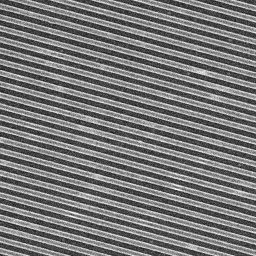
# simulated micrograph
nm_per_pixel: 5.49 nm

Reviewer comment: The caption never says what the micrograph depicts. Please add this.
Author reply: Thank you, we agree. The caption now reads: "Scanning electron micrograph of parallel lines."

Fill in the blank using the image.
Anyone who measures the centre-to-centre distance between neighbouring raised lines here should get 58.9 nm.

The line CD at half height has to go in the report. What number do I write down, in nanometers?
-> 28.5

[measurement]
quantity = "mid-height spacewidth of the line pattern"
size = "31.1 nanometers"